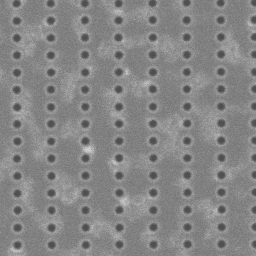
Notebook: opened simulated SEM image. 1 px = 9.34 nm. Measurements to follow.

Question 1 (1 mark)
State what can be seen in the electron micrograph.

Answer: a regular array of holes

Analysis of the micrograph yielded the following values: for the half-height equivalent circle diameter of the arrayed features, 78.8 nm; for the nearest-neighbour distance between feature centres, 0.16 um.